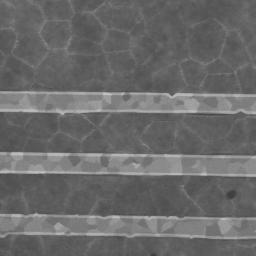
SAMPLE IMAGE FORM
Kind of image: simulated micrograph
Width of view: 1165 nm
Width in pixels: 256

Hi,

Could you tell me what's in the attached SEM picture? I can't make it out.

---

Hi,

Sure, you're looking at one or a few lines or trenches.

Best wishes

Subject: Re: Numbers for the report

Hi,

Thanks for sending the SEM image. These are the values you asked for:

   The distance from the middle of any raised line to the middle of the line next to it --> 281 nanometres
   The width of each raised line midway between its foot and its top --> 84.2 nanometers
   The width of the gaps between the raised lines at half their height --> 196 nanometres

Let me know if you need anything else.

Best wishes